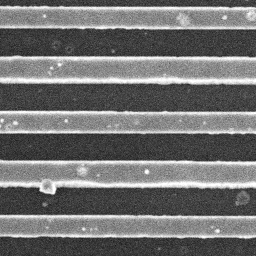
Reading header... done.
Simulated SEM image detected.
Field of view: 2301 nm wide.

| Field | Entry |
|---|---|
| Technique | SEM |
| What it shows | lines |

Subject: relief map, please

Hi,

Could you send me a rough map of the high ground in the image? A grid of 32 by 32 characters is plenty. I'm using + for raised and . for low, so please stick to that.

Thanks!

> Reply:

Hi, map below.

................................
++++++++++++++++++++++++++++++++
++++++++++++++++++++++++++++++++
.......+..+.++++++++++++++++++++
................................
................................
................................
++++++++++++++++++++++++++++++++
++++++++++++++++++++++++++++++++
++++++++++++++++++++++++++++++++
................................
................................
................................
................................
++++++++++++++++++++++++++++++++
++++++++++++++++++++++++++++++++
++++++++++++++++++++++++++++++++
................................
................................
................................
++++++++++++++++++++++++++++++++
++++++++++++++++++++++++++++++++
++++++++++++++++++++++++++++++++
.....++.........................
................................
................................
................................
++++++++++++++++++++++++++++++++
++++++++++++++++++++++++++++++++
.++++.++++++++++++++++++++++++++
................................
................................